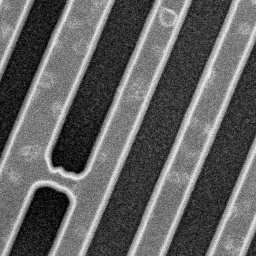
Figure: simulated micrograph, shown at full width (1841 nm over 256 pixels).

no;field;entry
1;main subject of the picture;one or a few lines or trenches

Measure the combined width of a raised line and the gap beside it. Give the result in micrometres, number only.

0.538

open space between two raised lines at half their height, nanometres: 295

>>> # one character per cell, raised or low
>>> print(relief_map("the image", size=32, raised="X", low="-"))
XXXX-----XXXXX-----XXXXX-----XXX
XXX-----XXXXXX-----XXXX------XXX
XXX-----XXXXX------XXXX-----XXXX
XX-----XXXXXX-----XXXX------XXXX
XX-----XXXXX------XXXX------XXXX
XX----XXXXXX-----XXXX------XXXX-
X-----XXXXX------XXXX------XXXX-
X----XXXXXX-----XXXXX-----XXXXX-
-----XXXXXX-----XXXX------XXXX--
-----XXXXX------XXXX-----XXXXX--
----XXXXXX-----XXXX------XXXX---
----XXXXX------XXXX------XXXX---
---XXXXXX-----XXXXX-----XXXXX---
---XXXXX------XXXX------XXXX----
---XXXXX------XXXX-----XXXXX----
--XXXXXX-----XXXX------XXXX-----
--XXXXX------XXXX------XXXX-----
-XXXXXX-----XXXX------XXXX------
-XXXXX------XXXX------XXXX------
XXXXXX-----XXXXX-----XXXXX-----X
XXXXXX-----XXXX------XXXX------X
XXXXXXXX--XXXXX-----XXXXX-----XX
XXXXXXXXXXXXXX------XXXX------XX
XXXX---XXXXXXX------XXXX-----XXX
XXXX-----XXXXX-----XXXXX-----XXX
XXX------XXXX------XXXX------XXX
XXX-----XXXXX-----XXXXX-----XXXX
XXX-----XXXX------XXXX------XXXX
XX------XXXX------XXXX-----XXXXX
XX-----XXXX------XXXX------XXXX-
X------XXXX------XXXX------XXXX-
X-----XXXXX-----XXXXX-----XXXXX-